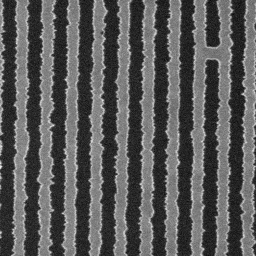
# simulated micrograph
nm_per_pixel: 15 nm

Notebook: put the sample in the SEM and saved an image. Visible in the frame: parallel lines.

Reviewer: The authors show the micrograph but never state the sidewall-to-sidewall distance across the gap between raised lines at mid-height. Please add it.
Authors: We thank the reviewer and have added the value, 227 nanometres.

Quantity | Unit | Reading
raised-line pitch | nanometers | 380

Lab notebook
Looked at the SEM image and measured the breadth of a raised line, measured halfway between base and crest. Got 0.155 microns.